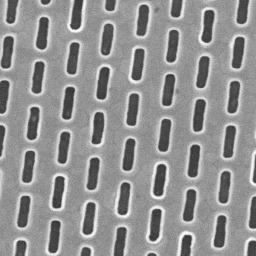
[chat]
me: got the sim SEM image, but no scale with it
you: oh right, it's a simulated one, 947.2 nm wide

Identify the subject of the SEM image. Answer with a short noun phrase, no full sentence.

a regular array of holes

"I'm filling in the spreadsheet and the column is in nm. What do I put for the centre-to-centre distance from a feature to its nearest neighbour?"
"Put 144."